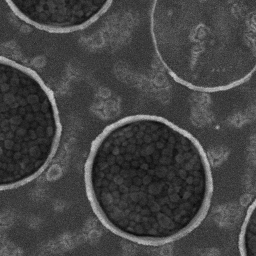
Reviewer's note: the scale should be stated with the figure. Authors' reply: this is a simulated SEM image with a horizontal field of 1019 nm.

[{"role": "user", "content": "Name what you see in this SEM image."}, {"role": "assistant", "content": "holes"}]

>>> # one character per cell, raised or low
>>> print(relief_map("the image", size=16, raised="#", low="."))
#.....##########
##...###########
################
################
..##############
...#############
...#############
...#############
...####.....####
...###......####
...###.......###
.#####.......###
######.......###
######......####
########...####.
###############.